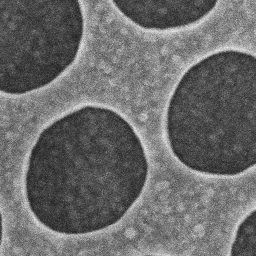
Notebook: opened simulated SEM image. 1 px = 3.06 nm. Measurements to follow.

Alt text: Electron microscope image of holes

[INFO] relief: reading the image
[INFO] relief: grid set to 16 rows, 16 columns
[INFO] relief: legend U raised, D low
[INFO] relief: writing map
DDDDDUUDDDDDDUUU
DDDDDUUUDDDDUUUU
DDDDDUUUUUUUUUUU
DDDDDUUUUUUUUDDD
DDDDUUUUUUUUDDDD
DDDUUUUUUUUDDDDD
UUUUUUUUUUUDDDDD
UUUDDDDDUUDDDDDD
UUDDDDDDDUDDDDDD
UUDDDDDDDUUDDDDD
UUDDDDDDDUUUDDDD
UUDDDDDDDUUUUUUU
UUDDDDDDDUUUUUUU
UUDDDDDDUUUUUUUD
UUUUDDUUUUUUUUUD
UUUUUUUUUUUUUUDD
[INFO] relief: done